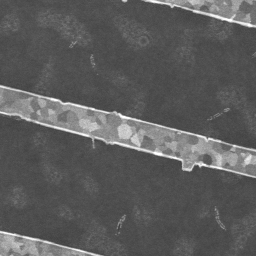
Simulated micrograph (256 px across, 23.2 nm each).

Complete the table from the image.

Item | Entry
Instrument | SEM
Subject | one or a few lines or trenches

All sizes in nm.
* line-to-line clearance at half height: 2740